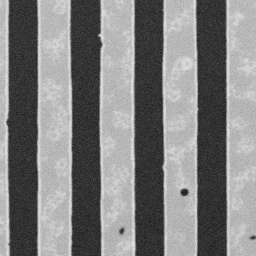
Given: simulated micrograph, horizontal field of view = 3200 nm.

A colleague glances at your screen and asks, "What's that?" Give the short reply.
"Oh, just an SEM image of parallel lines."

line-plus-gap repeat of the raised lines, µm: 0.787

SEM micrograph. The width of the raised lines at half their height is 405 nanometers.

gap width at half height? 392 nm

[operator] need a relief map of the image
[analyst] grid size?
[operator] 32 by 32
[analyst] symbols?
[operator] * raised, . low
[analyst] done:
*....****....****....***.....***
*....****....****....***.....***
*....****....****....***.....***
*....****....****....***....****
*....****....****....***....****
*....****....****....****...****
*....****....****....****...****
*....****....****...*****...****
*....****....****...*****...****
*....****....****...*****...****
*....****....****...*****...****
*....****....****...*****...****
*....****....****...*****...****
*....****....****...*****...****
*....****....****....****...****
*....****....****....****...****
*....****....****....****...****
*....****....****....****...****
*....****....****....****...****
*....****....****....****...****
*....****....****....****...****
*....****....****....****...****
*....****....****....****...****
*....****....****....****...****
*....****....****....****....***
*....****....****....****....***
*....****....****....****....***
*....****....****....****....***
*....****....****....****....***
*....****....****....***.....***
*....****....****....****....***
*....****....****....****....***